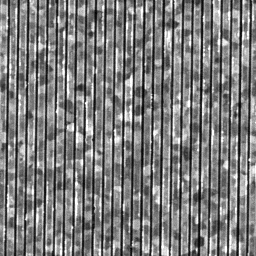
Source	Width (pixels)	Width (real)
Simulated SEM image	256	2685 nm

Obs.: parallel lines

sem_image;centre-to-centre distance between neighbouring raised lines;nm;101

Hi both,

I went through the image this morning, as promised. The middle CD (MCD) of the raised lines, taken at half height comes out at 69.5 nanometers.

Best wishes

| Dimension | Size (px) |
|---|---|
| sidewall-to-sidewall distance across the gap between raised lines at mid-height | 2.88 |